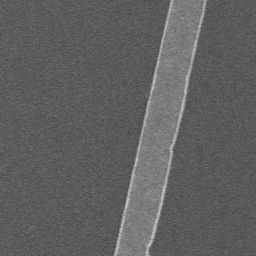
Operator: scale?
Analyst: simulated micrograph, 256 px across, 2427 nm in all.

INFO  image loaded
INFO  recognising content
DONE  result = one or a few lines or trenches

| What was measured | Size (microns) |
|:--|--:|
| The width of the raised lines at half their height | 0.312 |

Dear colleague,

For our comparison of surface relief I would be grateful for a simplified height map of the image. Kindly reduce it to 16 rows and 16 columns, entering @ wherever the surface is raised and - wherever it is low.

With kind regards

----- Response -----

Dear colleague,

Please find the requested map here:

-----------@@---
----------@@----
----------@@----
----------@@----
----------@@----
----------@@----
---------@@-----
---------@@-----
---------@@-----
---------@@-----
--------@@@-----
--------@@------
--------@@------
--------@@------
--------@@------
-------@@-------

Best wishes